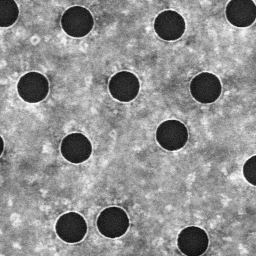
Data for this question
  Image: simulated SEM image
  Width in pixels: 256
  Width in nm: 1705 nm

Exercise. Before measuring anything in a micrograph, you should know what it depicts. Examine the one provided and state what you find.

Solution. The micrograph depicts a regular array of holes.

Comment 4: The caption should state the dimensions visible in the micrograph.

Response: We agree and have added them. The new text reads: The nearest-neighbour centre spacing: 0.455 micrometres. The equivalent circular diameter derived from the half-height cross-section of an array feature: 0.215 µm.